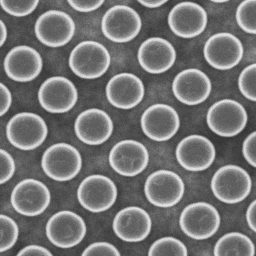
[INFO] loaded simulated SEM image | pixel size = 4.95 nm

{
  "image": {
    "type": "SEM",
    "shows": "a regular array of raised bodies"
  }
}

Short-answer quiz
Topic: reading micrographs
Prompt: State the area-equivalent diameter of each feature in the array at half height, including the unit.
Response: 0.176 microns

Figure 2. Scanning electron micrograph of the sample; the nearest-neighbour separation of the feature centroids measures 233 nanometers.